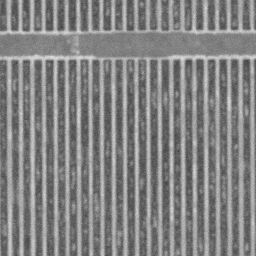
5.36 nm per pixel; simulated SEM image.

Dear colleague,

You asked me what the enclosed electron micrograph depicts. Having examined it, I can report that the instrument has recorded parallel lines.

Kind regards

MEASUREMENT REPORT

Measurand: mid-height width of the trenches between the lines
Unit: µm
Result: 0.0502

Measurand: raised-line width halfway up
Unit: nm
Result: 13.4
